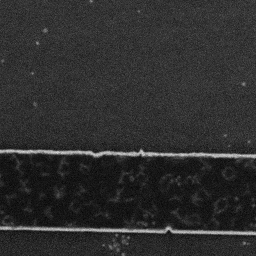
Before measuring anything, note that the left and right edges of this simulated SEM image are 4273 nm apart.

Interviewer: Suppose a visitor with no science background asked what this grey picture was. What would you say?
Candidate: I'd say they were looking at one or a few lines or trenches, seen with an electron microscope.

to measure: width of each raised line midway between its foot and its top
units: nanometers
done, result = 1300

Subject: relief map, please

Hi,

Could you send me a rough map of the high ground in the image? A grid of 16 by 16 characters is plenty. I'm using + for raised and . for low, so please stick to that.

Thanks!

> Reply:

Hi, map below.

................
................
................
................
................
................
................
................
................
+++.............
++++++++++++++++
++++++++++++++++
++++++++++++++++
++++++++++++++++
............++++
................